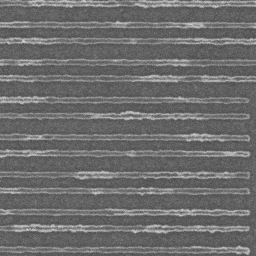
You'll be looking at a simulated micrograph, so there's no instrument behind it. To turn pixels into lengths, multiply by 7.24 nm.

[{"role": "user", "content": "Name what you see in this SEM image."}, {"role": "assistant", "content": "parallel lines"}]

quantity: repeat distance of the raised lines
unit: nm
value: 137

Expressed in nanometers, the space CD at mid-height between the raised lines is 113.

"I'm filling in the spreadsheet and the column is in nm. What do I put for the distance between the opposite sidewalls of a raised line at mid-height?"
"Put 35.3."